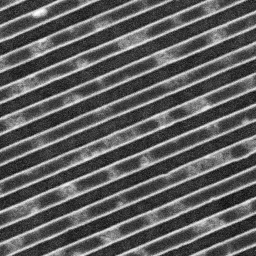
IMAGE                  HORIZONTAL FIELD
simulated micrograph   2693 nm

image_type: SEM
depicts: parallel lines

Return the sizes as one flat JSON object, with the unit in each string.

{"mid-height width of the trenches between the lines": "145 nanometers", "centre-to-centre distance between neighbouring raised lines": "28.7 px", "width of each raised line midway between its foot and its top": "0.154 microns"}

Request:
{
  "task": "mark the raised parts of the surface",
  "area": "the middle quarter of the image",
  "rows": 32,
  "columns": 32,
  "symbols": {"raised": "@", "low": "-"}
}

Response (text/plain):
@@@@@@----------@@@@@@@@--------
@@@@---------@@@@@@@@@@---------
@----------@@@@@@@@@---------@@@
---------@@@@@@@@----------@@@@@
------@@@@@@@@@---------@@@@@@@@
----@@@@@@@@@---------@@@@@@@@@-
-@@@@@@@@@@---------@@@@@@@@@---
@@@@@@@@---------@@@@@@@@@@-----
@@@@@@---------@@@@@@@@@--------
@@@@---------@@@@@@@@@---------@
@---------@@@@@@@@@----------@@@
--------@@@@@@@@@---------@@@@@@
-----@@@@@@@@@----------@@@@@@@@
---@@@@@@@@@---------@@@@@@@@@@-
-@@@@@@@@----------@@@@@@@@@----
@@@@@@@----------@@@@@@@@@------
@@@@@---------@@@@@@@@@@--------
@@----------@@@@@@@@@---------@@
----------@@@@@@@@@---------@@@@
--------@@@@@@@@---------@@@@@@@
-----@@@@@@@@@---------@@@@@@@@@
---@@@@@@@@@---------@@@@@@@@@@-
@@@@@@@@@---------@@@@@@@@@@----
@@@@@@@---------@@@@@@@@@@------
@@@@@---------@@@@@@@@@---------
@@---------@@@@@@@@@@---------@@
---------@@@@@@@@@@---------@@@@
------@@@@@@@@@@----------@@@@@@
----@@@@@@@@@@--------@@@@@@@@@@
--@@@@@@@@@@--------@@@@@@@@@@--
@@@@@@@@@---------@@@@@@@@@@----
@@@@@@@--------@@@@@@@@@@-------